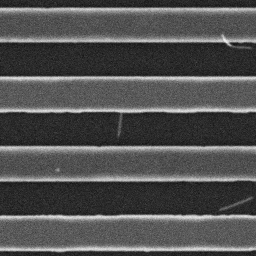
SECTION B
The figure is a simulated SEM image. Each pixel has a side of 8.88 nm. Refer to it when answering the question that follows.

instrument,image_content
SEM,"lines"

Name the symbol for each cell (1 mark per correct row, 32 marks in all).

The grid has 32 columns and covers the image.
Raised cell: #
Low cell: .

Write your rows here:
................................
################################
################################
################################
################################
................................
................................
................................
................................
................................
################################
################################
################################
################################
................................
................................
................................
................................
################################
################################
################################
################################
################################
................................
................................
................................
................................
################################
################################
################################
################################
................................